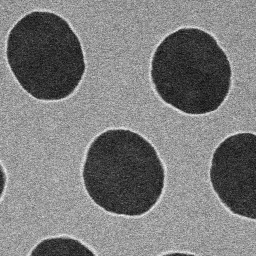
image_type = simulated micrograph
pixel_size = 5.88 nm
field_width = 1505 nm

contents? holes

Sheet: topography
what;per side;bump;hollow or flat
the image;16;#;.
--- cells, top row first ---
################
#...############
.....#####...###
.....#####....##
#....####.....##
#....#####....##
###########...##
################
######...######.
#####.....###...
#####.....###...
#####.....###...
######....####..
###############.
################
##...###########